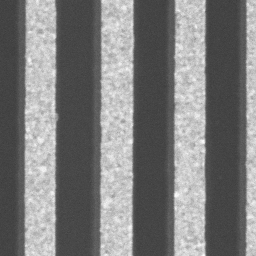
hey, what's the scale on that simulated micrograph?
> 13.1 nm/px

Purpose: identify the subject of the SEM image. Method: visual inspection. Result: lines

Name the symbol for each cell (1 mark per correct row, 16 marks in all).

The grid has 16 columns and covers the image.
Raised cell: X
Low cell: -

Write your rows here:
-XX---XX---XX--X
-XX---XX---XX--X
-XX---XX---XX--X
-XX---XX---XX--X
-XX---XX---XX--X
-XX---XX---XX--X
-XX---XX---XX--X
-XXX--XX---XX--X
-XX---XX---XX--X
-XX---XX---XX--X
-XX---XX---XX--X
-XX---XX---XX--X
-XX---XX---XX--X
-XX---XX---XX--X
-XX---XX---XX--X
-XX---XX---XX--X